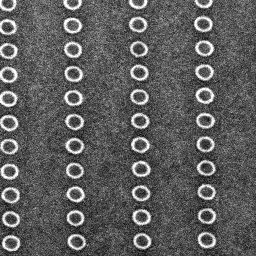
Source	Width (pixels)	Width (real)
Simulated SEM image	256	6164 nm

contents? a regular array of raised bodies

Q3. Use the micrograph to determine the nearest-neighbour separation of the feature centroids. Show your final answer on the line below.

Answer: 572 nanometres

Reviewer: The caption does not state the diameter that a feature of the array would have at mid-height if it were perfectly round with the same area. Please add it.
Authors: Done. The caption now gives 355 nm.